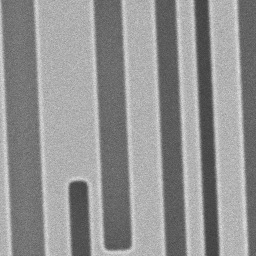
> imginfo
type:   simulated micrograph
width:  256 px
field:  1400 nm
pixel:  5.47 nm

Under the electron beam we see groups of lines, slits or small figures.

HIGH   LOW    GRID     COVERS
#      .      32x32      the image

....########...####...##..####..
.....#######...####...##..####..
.....#######...####...##..####..
.....#######...####...##..####..
.....#######...####...##..####..
.....#######...####...##..####..
.....#######....####..##..####..
.....#######....####..##..####..
.....#######....####..###..###..
.....#######....####...##..###..
.....#######....####...##..###..
.....#######....####...##..###..
#....#######....####...##..###..
#....#######....####...##..###..
#....#######....####...##..###..
#....#######....####...##..###..
#....#######....####...##..###..
#....#######....####...##..###..
#....#######....####...##..###..
#....#######....####...##..###..
#....#######....####...##..###..
#....#######....####...##..####.
#....#######....####...##..####.
#....###...##...####...##..####.
#....###...##...####...##..####.
#....####..##...####...##..####.
#.....###..##...####...##..####.
#.....###..##...####...##..####.
#.....###..##....###...##..####.
#.....###..##....###...##..####.
#.....###..##....###...###..###.
#.....###..##########..###..###.